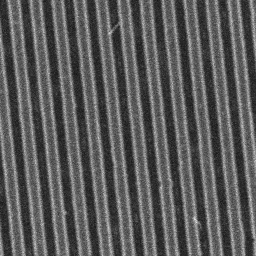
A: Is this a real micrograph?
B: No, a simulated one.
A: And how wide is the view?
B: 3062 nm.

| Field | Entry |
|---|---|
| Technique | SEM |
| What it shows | parallel lines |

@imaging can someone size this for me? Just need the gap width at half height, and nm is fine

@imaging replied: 128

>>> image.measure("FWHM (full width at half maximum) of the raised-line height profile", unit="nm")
128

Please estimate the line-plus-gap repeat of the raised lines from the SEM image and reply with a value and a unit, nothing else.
0.262 microns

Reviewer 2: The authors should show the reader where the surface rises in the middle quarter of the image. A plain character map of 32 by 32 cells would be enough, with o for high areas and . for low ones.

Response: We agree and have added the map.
o...ooo...ooo..ooo...oo...ooo...
o...ooo...ooo...oo...oo....oo...
oo..ooo...ooo...oo...ooo...oo...
oo...oo...ooo...oo...ooo...oo...
oo...oo...ooo...oo...ooo...oo...
oo...ooo..ooo...oo...ooo...oo...
oo...ooo..ooo...ooo..ooo...ooo..
oo...ooo...oo...ooo...oo...ooo..
oo...ooo...oo...ooo...oo...ooo..
ooo..ooo...ooo..ooo...ooo..ooo..
ooo...oo...oo...ooo...ooo..ooo..
ooo...oo...ooo..ooo...ooo..ooo..
ooo...oo...ooo..ooo...ooo...oo..
ooo...oo...ooo...oo...ooo...oo..
ooo...oo...ooo...oo...ooo...oo..
ooo...ooo..ooo...ooo..ooo...ooo.
.oo...ooo...oo...ooo...oo...ooo.
.oo...ooo...oo...ooo...oo...ooo.
.oo...ooo...oo...ooo...oo...ooo.
.oo....oo...oo...ooo...ooo..ooo.
.ooo...oo...oo...ooo...ooo...oo.
.ooo...oo...ooo..ooo...ooo...oo.
.ooo...oo...ooo...oo...ooo...oo.
.ooo...oo...ooo...oo...ooo...oo.
.ooo...ooo..ooo...ooo..ooo...ooo
..oo...ooo...oo...ooo..ooo...ooo
..oo...ooo...oo...ooo...oo...ooo
..oo...ooo...oo...ooo...oo...ooo
..oo...ooo...ooo..ooo...ooo..ooo
..ooo..ooo...ooo..ooo...ooo..ooo
..ooo..ooo...ooo..ooo...ooo..ooo
..ooo...oo...ooo...oo...ooo...oo